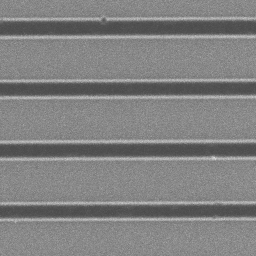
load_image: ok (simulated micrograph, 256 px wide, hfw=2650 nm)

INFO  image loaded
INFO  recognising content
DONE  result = one or a few lines or trenches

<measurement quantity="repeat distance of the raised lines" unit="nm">633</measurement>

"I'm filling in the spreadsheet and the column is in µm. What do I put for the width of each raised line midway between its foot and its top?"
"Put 0.184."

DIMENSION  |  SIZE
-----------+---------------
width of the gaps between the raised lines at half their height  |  0.454 um